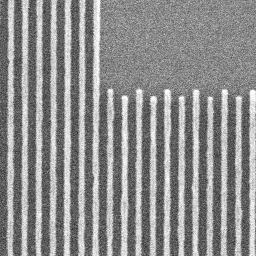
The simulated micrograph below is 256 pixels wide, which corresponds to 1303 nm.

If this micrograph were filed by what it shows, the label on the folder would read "parallel lines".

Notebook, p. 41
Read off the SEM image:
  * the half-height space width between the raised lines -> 0.0484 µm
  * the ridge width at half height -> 26.1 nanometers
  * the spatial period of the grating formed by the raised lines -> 72.5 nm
